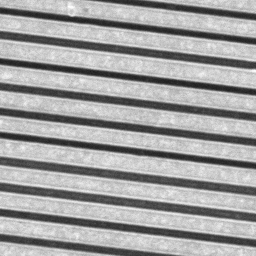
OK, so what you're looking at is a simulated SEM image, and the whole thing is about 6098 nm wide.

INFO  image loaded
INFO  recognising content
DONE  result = parallel lines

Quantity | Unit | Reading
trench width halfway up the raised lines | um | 0.207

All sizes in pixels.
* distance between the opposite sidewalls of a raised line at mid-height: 16.5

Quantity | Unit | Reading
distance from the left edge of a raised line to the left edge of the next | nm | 597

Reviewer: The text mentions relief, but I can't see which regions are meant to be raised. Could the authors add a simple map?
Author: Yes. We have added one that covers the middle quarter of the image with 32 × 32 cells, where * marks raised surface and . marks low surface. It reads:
..******************************
..........**********************
*..................*************
**********.................*****
******************..............
**************************......
.*******************************
..........**********************
..................**************
*******...................******
***************.................
***********************.........
*******************************.
.......*************************
...............*****************
****...................*********
************....................
********************............
*****************************...
......*.************************
................****************
*******...............**********
***************................*
***********************.........
********************************
.....***************************
.............*******************
......................**********
********......................**
*****************...............
*************************.......
..******************************